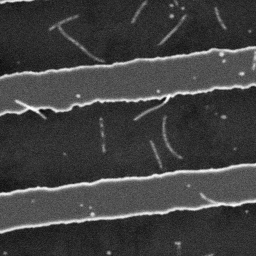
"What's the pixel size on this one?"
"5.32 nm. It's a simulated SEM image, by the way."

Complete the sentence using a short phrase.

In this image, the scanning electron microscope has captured lines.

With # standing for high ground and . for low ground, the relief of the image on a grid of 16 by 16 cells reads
................
................
................
...........#####
..##############
###############.
######..........
................
................
................
..............##
.....###########
################
########........
................
................